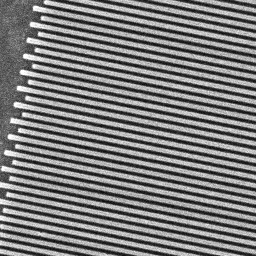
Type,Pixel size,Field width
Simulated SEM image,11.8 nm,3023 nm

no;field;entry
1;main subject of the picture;parallel lines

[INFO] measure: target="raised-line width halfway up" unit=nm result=46.3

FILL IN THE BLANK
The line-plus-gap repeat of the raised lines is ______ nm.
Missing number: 96.4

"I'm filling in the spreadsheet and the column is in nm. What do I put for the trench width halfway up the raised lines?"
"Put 46.3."